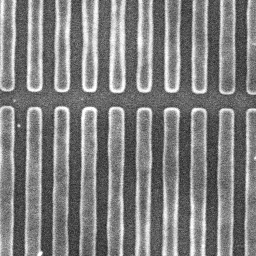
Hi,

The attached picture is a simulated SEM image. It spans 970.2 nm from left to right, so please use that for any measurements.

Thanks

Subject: groups of lines, slits or small figures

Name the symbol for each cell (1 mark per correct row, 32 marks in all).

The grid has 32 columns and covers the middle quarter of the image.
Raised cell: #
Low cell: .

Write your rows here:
#....###....###....###...####...
#....###....###....###...####...
#....###....###....###...####...
#....###....###....###...####...
#....###....###....###...###....
#....###....###....###...###....
#....##.....###....##.....##....
................................
................................
................................
................................
#....###....###....###...###....
#....###...####...####...####...
#....###...####...####...####...
#....###...####...####...####...
#....###...####...####...####...
#....###...####...####...###....
#....###...####...####...###....
#....###...####...####...###....
#....###...####...####...###....
#...####...####...####...###....
#...####...####...####...###....
#....###...####...####...###....
#....###...####...####...###....
#....###...####...####...###....
#....###...####...####...###....
#...####...####...####...###....
#...####...####...####...###....
#...####...####...####...###....
#...####...####...####...###....
#...####...####...####...###....
#...####...###....###....###....